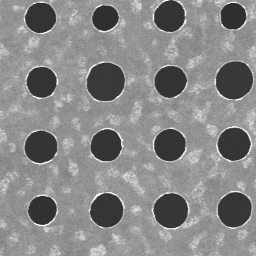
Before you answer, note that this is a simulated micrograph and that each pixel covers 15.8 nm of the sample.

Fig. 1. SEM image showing a regular array of holes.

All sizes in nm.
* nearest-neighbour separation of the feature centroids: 1010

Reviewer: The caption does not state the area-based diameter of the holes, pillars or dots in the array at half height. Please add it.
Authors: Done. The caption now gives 513 nm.